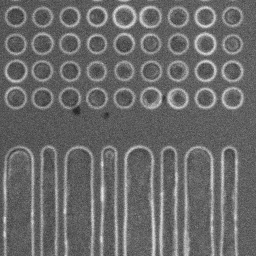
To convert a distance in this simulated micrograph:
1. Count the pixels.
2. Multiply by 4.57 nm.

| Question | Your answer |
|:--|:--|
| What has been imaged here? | groups of lines, slits or small figures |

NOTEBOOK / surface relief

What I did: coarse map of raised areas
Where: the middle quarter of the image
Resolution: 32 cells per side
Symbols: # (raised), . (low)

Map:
...###....###....###....###...##
....##....###....###....##.....#
...###....###....###....##.....#
...####...####..####...####...##
################################
################################
...####..#####..#####..#####.###
...###....###....###....##....##
....##.....##....##.....##.....#
....##....###....###....##.....#
...####..#####..#####..####...##
################################
################################
################################
################################
################################
################################
################################
################################
################################
################################
##....####...####....####..#####
#.....####...###......###...###.
.......###...###......##....###.
.......###...###......##....##..
.......###...###......##....##..
.......###...###......##....##..
.......###...###......##....##..
.......###...##.......##....##..
.......###...##.......##....##..
.......###...##.......##....###.
.......###...##.......##....###.